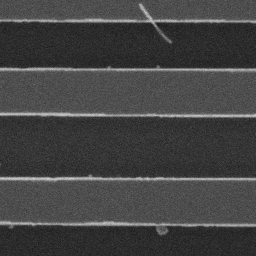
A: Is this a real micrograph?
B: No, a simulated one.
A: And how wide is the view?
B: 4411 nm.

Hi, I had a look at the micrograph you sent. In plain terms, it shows lines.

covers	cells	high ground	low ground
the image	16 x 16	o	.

oooooooooooooooo
................
................
................
oooooooooooooooo
oooooooooooooooo
oooooooooooooooo
................
................
................
................
oooooooooooooooo
oooooooooooooooo
oooooooooooooooo
................
................